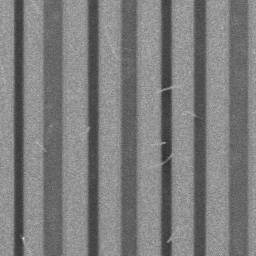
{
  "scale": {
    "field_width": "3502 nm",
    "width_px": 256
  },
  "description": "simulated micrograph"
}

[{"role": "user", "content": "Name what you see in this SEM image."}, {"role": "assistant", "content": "parallel lines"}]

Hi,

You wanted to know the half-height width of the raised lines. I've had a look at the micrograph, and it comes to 321 nanometres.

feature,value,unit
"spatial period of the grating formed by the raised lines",504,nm